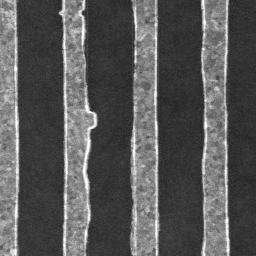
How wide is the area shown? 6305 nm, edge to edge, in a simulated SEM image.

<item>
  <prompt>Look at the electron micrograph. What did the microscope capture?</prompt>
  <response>one or a few lines or trenches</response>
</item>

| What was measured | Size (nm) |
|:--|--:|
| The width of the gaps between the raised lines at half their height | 1210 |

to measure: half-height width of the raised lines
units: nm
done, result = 526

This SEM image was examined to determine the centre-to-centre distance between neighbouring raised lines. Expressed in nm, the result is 1720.